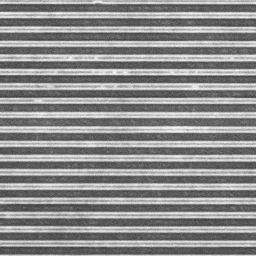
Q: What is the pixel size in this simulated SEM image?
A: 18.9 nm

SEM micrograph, parallel lines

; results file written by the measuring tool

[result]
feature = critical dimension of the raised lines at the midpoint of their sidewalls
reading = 85.2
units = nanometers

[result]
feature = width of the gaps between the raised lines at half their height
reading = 0.185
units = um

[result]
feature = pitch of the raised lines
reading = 14.3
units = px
